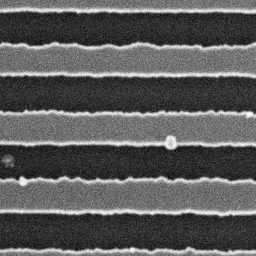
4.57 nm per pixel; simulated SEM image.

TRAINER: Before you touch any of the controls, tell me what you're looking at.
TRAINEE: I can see lines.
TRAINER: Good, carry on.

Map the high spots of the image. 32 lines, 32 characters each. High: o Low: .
oooooooooooooooooooooooooooooooo
..............................oo
................................
................................
................................
ooo...ooo........oo............o
oooooooooooooooooooooooooooooooo
oooooooooooooooooooooooooooooooo
oooooooooooooooooooooooooooooooo
...........oo...o.o..oo...o....o
................................
................................
................................
................................
oooooooooooooooooooooooooooooooo
oooooooooooooooooooooooooooooooo
oooooooooooooooooooooooooooooooo
oooooooooooooooooooooooooooooooo
.....................o..........
................................
................................
................................
ooooooooooo.ooo.ooooo.o.oooo..o.
oooooooooooooooooooooooooooooooo
oooooooooooooooooooooooooooooooo
oooooooooooooooooooooooooooooooo
oooooooooooooooooooooooooooooooo
................................
................................
................................
................................
oooooooooooooooooooooooooooooooo